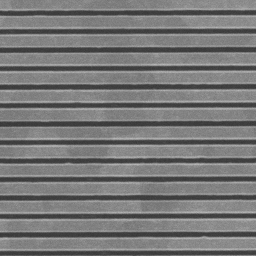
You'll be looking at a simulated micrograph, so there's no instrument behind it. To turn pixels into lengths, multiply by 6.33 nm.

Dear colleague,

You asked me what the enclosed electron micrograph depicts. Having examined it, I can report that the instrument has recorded parallel lines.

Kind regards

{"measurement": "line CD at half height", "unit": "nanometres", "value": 74.4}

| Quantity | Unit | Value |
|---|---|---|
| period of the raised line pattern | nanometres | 117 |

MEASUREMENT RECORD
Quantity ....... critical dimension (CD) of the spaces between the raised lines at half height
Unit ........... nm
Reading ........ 45.1